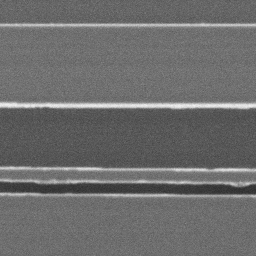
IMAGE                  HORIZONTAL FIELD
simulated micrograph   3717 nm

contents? lines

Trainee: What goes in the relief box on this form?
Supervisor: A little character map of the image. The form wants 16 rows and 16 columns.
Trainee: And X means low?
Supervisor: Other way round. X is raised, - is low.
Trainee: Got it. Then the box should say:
XXXXXXXXXXXXXXXX
XXXXXXXXXXXXXXXX
XXXXXXXXXXXXXXXX
XXXXXXXXXXXXXXXX
XXXXXXXXXXXXXXXX
XXXXXXXXXXXXXXXX
XXXXXXXXXXXXXXXX
----------------
----------------
----------------
----------------
XXXXXXXXXXXXXXXX
XXXXXXXXXXXXXXXX
XXXXXXXXXXXXXXXX
XXXXXXXXXXXXXXXX
XXXXXXXXXXXXXXXX